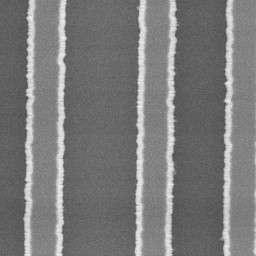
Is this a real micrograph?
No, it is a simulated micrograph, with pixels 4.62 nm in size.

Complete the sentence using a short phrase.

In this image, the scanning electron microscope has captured lines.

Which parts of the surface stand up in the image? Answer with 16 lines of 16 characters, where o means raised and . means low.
..oo.....oo...oo
..oo.....oo...oo
..oo.....oo...oo
..oo.....oo...oo
..oo.....oo...oo
..oo.....oo...oo
..oo.....oo...oo
..oo.....oo...oo
..oo.....oo...oo
..oo.....oo...oo
..oo.....oo...oo
..oo.....oo...oo
..oo.....oo...oo
..oo.....oo...oo
..oo.....oo...oo
..oo.....oo...oo